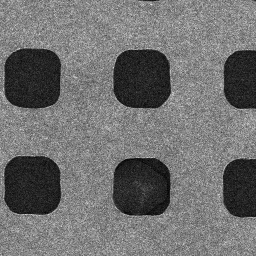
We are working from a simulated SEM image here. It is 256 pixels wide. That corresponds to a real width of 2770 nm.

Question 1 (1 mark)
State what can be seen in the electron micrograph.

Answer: holes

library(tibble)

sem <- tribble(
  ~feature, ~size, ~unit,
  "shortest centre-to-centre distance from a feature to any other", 1.16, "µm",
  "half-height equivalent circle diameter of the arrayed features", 668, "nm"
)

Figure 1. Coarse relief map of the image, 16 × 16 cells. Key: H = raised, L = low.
HHHHHHHHHHHHHHHH
HHHHHHHHHHHHHHHH
HHHHHHHHHHHHHHHH
HLLLHHHLLLHHHHLL
LLLLHHHLLLLHHHLL
LLLLHHHLLLLHHHLL
HLLHHHHHLLHHHHLL
HHHHHHHHHHHHHHHH
HHHHHHHHHHHHHHHH
HHHHHHHHHHHHHHHH
LLLLHHHLLLHHHHLL
LLLLHHHLLLLHHHLL
LLLLHHHLLLLHHHLL
HHHHHHHHLHHHHHHL
HHHHHHHHHHHHHHHH
HHHHHHHHHHHHHHHH